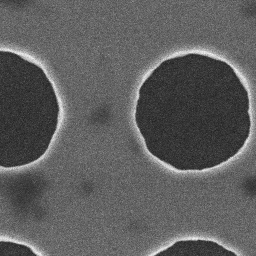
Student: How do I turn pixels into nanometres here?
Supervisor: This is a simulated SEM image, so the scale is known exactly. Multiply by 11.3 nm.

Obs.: holes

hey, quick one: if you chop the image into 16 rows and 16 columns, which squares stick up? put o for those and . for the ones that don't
oooooooooooooooo
oooooooooooooooo
oooooooooooooooo
.oooooooooo..ooo
...oooooo......o
...oooooo......o
....ooooo.......
....ooooo.......
...oooooo.......
...oooooo......o
ooooooooooo..ooo
oooooooooooooooo
oooooooooooooooo
oooooooooooooooo
oooooooooooooooo
..oooooooo....oo